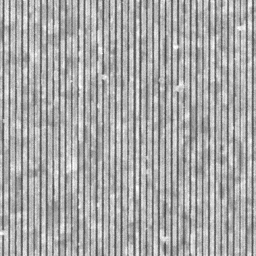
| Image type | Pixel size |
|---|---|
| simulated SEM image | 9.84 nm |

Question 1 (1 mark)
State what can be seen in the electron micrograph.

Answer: parallel lines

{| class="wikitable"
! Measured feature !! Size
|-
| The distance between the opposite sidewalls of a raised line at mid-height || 41.8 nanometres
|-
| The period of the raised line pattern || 0.0614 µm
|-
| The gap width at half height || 2.5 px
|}